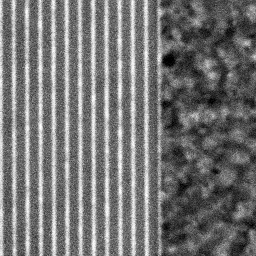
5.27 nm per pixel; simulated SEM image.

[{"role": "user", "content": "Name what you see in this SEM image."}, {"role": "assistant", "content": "parallel lines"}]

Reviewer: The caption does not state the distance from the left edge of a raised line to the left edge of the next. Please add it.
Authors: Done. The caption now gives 69.8 nanometers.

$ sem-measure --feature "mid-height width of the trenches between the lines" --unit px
12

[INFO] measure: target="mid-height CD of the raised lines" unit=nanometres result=7.2